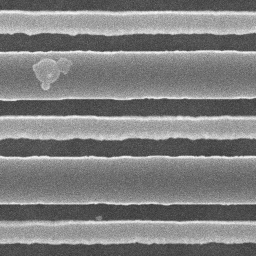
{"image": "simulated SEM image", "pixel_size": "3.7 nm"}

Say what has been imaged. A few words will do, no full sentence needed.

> lines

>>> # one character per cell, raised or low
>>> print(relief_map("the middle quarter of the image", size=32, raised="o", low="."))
oooooooooooooooooooooooooooooooo
oooooooooooooooooooooooooooooooo
oooooooooooooooooooooooooooooooo
oooooooooooooooooooooooooooooooo
oooooooooooooooooooooooooooooooo
oooooooooooooooooooooooooooooooo
oooooooooooooooooooooooooooooooo
oooooooooooooooooooooooooooooooo
oooooooooooooooooooo..oooooooooo
................................
................................
................................
................................
oooooooo....................oo..
oooooooooooooooooooooooooooooooo
oooooooooooooooooooooooooooooooo
oooooooooooooooooooooooooooooooo
oooooooooooooooooooooooooooooooo
o.......ooooooo.......oo........
................................
................................
................................
................................
oooooooooo..oooooooooooooooooooo
oooooooooooooooooooooooooooooooo
oooooooooooooooooooooooooooooooo
oooooooooooooooooooooooooooooooo
oooooooooooooooooooooooooooooooo
oooooooooooooooooooooooooooooooo
oooooooooooooooooooooooooooooooo
oooooooooooooooooooooooooooooooo
oooooooooooooooooooooooooooooooo